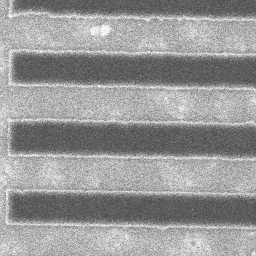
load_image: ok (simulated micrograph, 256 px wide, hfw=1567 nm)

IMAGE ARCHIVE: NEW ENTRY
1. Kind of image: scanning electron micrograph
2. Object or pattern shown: one or a few lines or trenches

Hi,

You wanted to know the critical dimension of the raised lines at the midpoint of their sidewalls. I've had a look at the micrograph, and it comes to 219 nanometers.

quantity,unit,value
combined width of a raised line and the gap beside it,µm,0.425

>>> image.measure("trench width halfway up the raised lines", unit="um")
0.203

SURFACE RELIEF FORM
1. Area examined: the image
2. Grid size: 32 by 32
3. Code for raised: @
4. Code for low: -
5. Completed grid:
-@@@@@@@@@@@@@@@@@@@@@@@@@@@@@@@
-@@@@@@@@@@@@@@@@@@@@@@@@@@@@@@@
--------------------------@@@@@@
--------------------------------
--------------------------------
--------------------------------
-@@@@@@@@@@@@-----@-------------
-@@@@@@@@@@@@@@@@@@@@@@@@@@@@@@@
-@@@@@@@@@@@@@@@@@@@@@@@@@@@@@@@
-@@@@@@@@@@@@@@@@@@@@@@@@@@@@@@@
-@@@@@@@@@@@@@@@@@@@@@@@@@@@@@@@
--------------------------------
--------------------------------
--------------------------------
--------------------------------
-@@@@@@@@@@@@@@@@@@@@@@@@@@@@@@@
-@@@@@@@@@@@@@@@@@@@@@@@@@@@@@@@
-@@@@@@@@@@@@@@@@@@@@@@@@@@@@@@@
-@@@@@@@@@@@@@@@@@@@@@@@@@@@@@@@
-@@---@@@@@@@@@@@@@@@@@@@@@@@@@@
--------------------------------
--------------------------------
--------------------------------
--------------------------------
-@@@@@@@@@@@@@@@@@@@@@@@@@@@@@@@
-@@@@@@@@@@@@@@@@@@@@@@@@@@@@@@@
-@@@@@@@@@@@@@@@@@@@@@@@@@@@@@@@
-@@@@@@@@@@@@@@@@@@@@@@@@@@@@@@@
--------------------@-----@@@-@@
--------------------------------
--------------------------------
--------------------------------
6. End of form